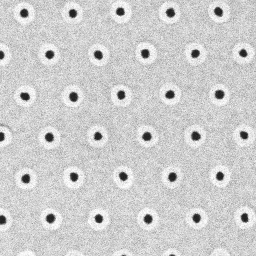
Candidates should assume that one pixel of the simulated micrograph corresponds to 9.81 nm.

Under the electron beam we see a regular array of ring-shaped raised bodies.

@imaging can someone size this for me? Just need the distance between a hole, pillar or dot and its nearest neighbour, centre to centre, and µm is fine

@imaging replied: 0.463